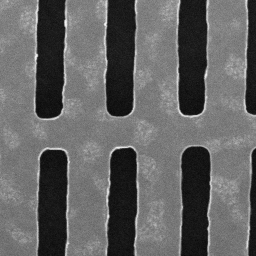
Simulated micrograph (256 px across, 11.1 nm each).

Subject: holes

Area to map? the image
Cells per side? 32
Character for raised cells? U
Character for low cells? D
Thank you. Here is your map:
UUUUUDDDUUUUUDDDDUUUUUDDDDUUUUUD
UUUUUDDDUUUUUDDDDUUUUUDDDDUUUUUD
UUUUUDDDUUUUUDDDDUUUUUDDDDUUUUUD
UUUUUDDDUUUUUDDDDUUUUUDDDDUUUUUD
UUUUUDDDUUUUUDDDDUUUUUDDDDUUUUUD
UUUUUDDDUUUUUDDDDUUUUUDDDDUUUUUD
UUUUUDDDUUUUUDDDDUUUUUDDDDUUUUUD
UUUUUDDDUUUUUDDDDUUUUUDDDDUUUUUD
UUUUUDDDUUUUUDDDDUUUUUDDDDUUUUUD
UUUUDDDDUUUUUDDDDUUUUUDDDDUUUUUD
UUUUDDDDUUUUUDDDDUUUUUDDDDUUUUUD
UUUUDDDDUUUUUDDDDUUUUUDDDDUUUUUD
UUUUDDDDUUUUUDDDDUUUUUDDDDUUUUUD
UUUUDDDDUUUUUDDDDUUUUUDDDUUUUUUD
UUUUUDDUUUUUUUDUUUUUUUUUUUUUUUUU
UUUUUUUUUUUUUUUUUUUUUUUUUUUUUUUU
UUUUUUUUUUUUUUUUUUUUUUUUUUUUUUUU
UUUUUUUUUUUUUUUUUUUUUUUUUUUUUUUU
UUUUUUUUUUUUUUUDUUUUUUUDDDUUUUUU
UUUUUDDDUUUUUUDDDUUUUUUDDDUUUUUD
UUUUUDDDDUUUUUDDDUUUUUUDDDUUUUUD
UUUUUDDDUUUUUUDDDUUUUUUDDDUUUUUD
UUUUUDDDDUUUUUDDDUUUUUUDDDUUUUUD
UUUUUDDDUUUUUUDDDUUUUUUDDDUUUUUD
UUUUUDDDUUUUUUDDDUUUUUUDDDUUUUUD
UUUUUDDDUUUUUUDDDUUUUUUDDDUUUUUD
UUUUUDDDUUUUUUDDDUUUUUUDDDUUUUUD
UUUUUDDDUUUUUUDDDUUUUUUDDDUUUUUD
UUUUUDDDUUUUUDDDDUUUUUUDDDUUUUUD
UUUUUDDDUUUUUDDDDUUUUUUDDDUUUUUD
UUUUUDDDUUUUUDDDDUUUUUUDDDUUUUUD
UUUUUDDDUUUUUDDDDUUUUUUDDDUUUUUD